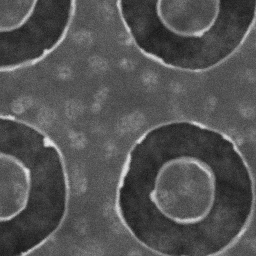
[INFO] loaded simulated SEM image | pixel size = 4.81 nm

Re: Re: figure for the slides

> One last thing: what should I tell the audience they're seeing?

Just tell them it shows ring-shaped grooves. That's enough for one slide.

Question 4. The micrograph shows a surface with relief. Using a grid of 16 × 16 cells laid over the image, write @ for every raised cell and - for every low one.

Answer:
@@--@@@@--@@@@--
@---@@@@--@@@---
----@@@@-------@
--@@@@@@@@----@@
@@@@@@@@@@@@@@@@
@@@@@@@@@@@@@@@@
@@@@@@@@@@@@@@@@
-@@@@@@@@@@@@@@@
---@@@@@@-----@@
----@@@@-------@
@@--@@@@--@@@--@
@@--@@@@--@@@---
@@--@@@---@@@---
@---@@@@--@@@---
---@@@@@-------@
--@@@@@@@-----@@